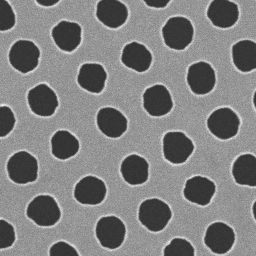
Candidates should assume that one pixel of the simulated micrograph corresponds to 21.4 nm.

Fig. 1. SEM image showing a regular array of holes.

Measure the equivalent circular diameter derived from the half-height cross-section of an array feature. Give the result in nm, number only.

664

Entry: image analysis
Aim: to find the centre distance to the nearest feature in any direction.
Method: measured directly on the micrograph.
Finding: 1030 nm